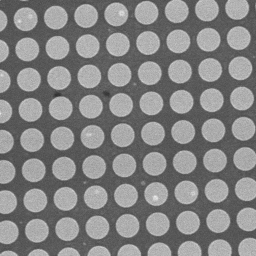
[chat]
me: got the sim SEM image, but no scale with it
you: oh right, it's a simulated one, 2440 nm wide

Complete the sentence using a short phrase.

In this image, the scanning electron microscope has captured an array of small figures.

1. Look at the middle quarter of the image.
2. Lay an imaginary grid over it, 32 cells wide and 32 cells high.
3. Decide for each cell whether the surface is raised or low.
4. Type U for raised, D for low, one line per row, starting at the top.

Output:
DDDDDUUDDDDDUUUUDDDUUUUUDDUUUUUD
UDDDUUUUUDDUUUUUUDDUUUUUDDUUUUUU
UDDDUUUUUDDUUUUUUDDUUUUUDDUUUUUU
UUDDUUUUUDDUUUUUDDDUUUUUDDDUUUUD
UUDDUUUUUDDDUUUUDDDDUUUDDDDDUUDD
UDDDDUUUDDDDDUDDDDDDDDDDDDDDDDDD
DDDDDDDDDDDDDDDDDDDDDDDDDDDDDDDD
DDDDDDDDDDDDDDUDDDDDUUUDDDDUUUUD
DDDDDUUUDDDDUUUUDDDUUUUUDDDUUUUU
UUDDUUUUUDDDUUUUUDDUUUUUUDDUUUUU
UUDDUUUUUDDDUUUUUDDUUUUUUDDUUUUU
UUDDUUUUUDDDUUUUUDDUUUUUDDDUUUUD
UUDDDUUUUDDDDUUUDDDDDUUDDDDDDDDD
UDDDDDDDDDDDDDDDDDDDDDDDDDDDDDDD
DDDDDDDDDDDDDDDDDDDDDDDDDDDDDUUD
DDDDDDDUDDDDDUUUDDDDUUUUDDDUUUUU
UUDDDUUUUDDDUUUUUDDUUUUUUDDUUUUU
UUDDUUUUUUDDUUUUUDDDUUUUUDDUUUUU
UUDDUUUUUUDDUUUUUDDDUUUUUDDUUUUU
UUDDUUUUUUDDUUUUUDDDUUUUDDDDUUUD
UUDDDUUUUDDDDDUUDDDDDDDDDDDDDDDD
DDDDDDDDDDDDDDDDDDDDDDDDDDDDDDDD
DDDDDDDDDDDDDDDDDDDDDUUUDDDDUUUU
UDDDDDUUUDDDDUUUUDDDUUUUUDDDUUUU
UUDDDUUUUUDDUUUUUUDDUUUUUDDUUUUU
UUUDDUUUUUDDUUUUUUDDUUUUUDDDUUUU
UUUDDUUUUUDDUUUUUUDDUUUUUDDDUUUU
UUDDDUUUUUDDDUUUUDDDDUUUDDDDDDDD
UUDDDDDUDDDDDDDDDDDDDDDDDDDDDDDD
DDDDDDDDDDDDDDDDDDDDDDDDDDDDDUUU
DDDDDDDDDDDDDDUUUDDDDUUUUDDDUUUU
UUDDDDUUUUDDDUUUUUDDUUUUUUDDUUUU